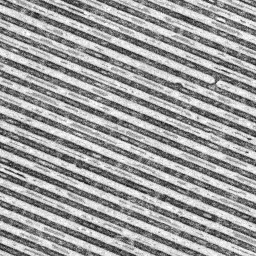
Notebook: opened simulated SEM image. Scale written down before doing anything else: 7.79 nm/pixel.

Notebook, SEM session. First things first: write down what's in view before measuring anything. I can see parallel lines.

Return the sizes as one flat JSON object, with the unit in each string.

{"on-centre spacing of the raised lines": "104 nm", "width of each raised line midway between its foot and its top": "40.6 nm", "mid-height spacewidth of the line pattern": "0.0613 micrometres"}